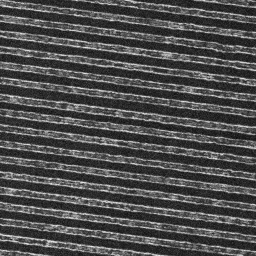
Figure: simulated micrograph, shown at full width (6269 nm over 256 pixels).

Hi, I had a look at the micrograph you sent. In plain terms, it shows parallel lines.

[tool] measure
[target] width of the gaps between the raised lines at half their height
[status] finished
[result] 218 nanometers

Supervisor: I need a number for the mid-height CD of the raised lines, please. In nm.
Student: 155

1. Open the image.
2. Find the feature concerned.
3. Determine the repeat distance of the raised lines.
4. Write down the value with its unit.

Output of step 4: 380 nanometres